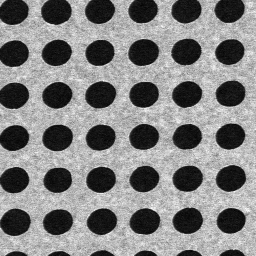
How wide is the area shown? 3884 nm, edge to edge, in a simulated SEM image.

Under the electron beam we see a regular array of holes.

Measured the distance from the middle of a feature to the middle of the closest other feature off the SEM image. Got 0.638 um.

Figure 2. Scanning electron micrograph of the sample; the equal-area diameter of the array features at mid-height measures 429 nm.